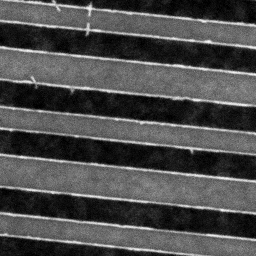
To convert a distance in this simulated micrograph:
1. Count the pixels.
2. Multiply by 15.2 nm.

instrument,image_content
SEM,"parallel lines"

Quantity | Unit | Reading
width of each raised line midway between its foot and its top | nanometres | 428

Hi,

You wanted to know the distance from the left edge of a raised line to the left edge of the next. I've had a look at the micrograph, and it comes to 837 nm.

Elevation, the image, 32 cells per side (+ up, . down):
.....+++++++++++++++++++++++++++
...............+++++++++++++++++
........................++++++++
+++++++++.......................
+++++++++++++++++++.............
++++++++++++++++++++++++++++....
.....+++++++++++++++++++++++++++
...............+++++++++++++++++
........................++++++++
................................
++++++..........................
++++++++++++++++................
+++++++++++++++++++++++++.......
.+++++++++++++++++++++++++++++++
...........+++++++++++++++++++++
....................++++++++++++
+++++.........................++
+++++++++++++++.................
++++++++++++++++++++++++........
.+++++++++++++++++++++++++++++++
...........+++++++++++++++++++++
.....................+++++++++++
..............................++
++..............................
++++++++++++....................
++++++++++++++++++++++..........
++++++++++++++++++++++++++++++..
.......+++++++++++++++++++++++++
.................+++++++++++++++
++........................++++++
+++++++++++.....................
+++++++++++++++++++++...........